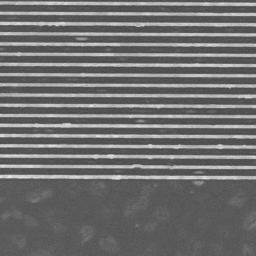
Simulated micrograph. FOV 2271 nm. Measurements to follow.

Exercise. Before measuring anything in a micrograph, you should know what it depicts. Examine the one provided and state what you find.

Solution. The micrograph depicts parallel lines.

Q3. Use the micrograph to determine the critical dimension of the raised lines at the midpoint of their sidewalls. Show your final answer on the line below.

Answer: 23.3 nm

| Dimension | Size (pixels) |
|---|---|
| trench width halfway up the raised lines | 7.13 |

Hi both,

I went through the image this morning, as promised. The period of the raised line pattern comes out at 90.5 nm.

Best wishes